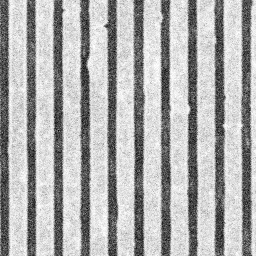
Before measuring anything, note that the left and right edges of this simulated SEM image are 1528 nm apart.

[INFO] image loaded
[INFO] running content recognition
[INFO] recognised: parallel lines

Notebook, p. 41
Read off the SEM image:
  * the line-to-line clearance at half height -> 67.1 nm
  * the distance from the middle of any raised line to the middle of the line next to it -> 161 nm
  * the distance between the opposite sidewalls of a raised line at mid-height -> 94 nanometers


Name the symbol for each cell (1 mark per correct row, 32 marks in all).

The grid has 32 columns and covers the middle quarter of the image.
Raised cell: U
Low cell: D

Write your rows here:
UUUUDDUUUUDDDDUUUDDDUUUUDDDUUUUD
UUUUDDUUUUDDDUUUUDDDUUUUDDDUUUUD
UUUUDDDUUUDDDUUUUDDDUUUUDDDUUUUD
UUUUDDDUUUDDDUUUUDDDUUUUDDDUUUUD
UUUUDDDUUUDDDUUUUDDDUUUUDDDUUUUD
UUUUDDDUUUDDDUUUUDDDUUUUDDDUUUUD
UUUUDDDUUUDDDUUUUDDDUUUUDDDUUUUD
UUUUDDDUUUUDDUUUUDDDUUUUDDDUUUUD
UUUUDDDUUUUDDUUUUDDDDUUUDDDUUUUD
UUUUDDDUUUUDDUUUUDDDUUUUDDDUUUUD
UUUUDDDUUUUDDUUUUDDDUUUUDDDUUUUD
UUUUDDDUUUUDDUUUUDDDUUUUDDDUUUUD
UUUUDDDUUUUDDUUUUDDDUUUUDDDUUUUD
UUUUDDDUUUDDDUUUUDDDUUUUDDDUUUUD
UUUUDDDUUUDDDDUUUDDDUUUUDDDUUUUD
UUUUDDDUUUDDDDUUUDDDUUUUDDDUUUUD
UUUUDDDUUUDDDDUUUDDDUUUUDDDUUUDD
UUUUDDDUUUDDDDUUUDDDUUUUDDDUUUDD
UUUUDDDUUUDDDDUUUDDDUUUUDDDUUUDD
UUUUDDDUUUDDDDUUUDDDUUUUDDDUUUDD
UUUUDDDUUUDDDDUUUDDDUUUUDDDUUUDD
UUUUDDDUUUDDDDUUUDDDUUUUDDDUUUDD
UUUUDDDUUUDDDDUUUDDDUUUUDDDUUUDD
UUUUDDDUUUDDDDUUUDDDUUUUDDDUUUDD
UUUUDDDUUUDDDDUUUDDDUUUUDDDUUUDD
UUUUDDDUUUDDDDUUUDDDUUUUDDDUUUDD
UUUUDDDUUUDDDDUUUDDDUUUUDDDUUUDD
UUUUDDDUUUDDDDUUUDDDUUUUDDDUUUDD
UUUUDDDUUUDDDDUUUDDDUUUUDDDUUUDD
UUUUDDDUUUDDDDUUUDDDUUUUDDDUUUDD
UUUUDDDUUUDDDDUUUDDDUUUUDDDUUUUD
UUUUDDDUUUDDDDUUUDDDUUUUDDDUUUUD